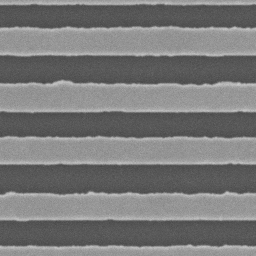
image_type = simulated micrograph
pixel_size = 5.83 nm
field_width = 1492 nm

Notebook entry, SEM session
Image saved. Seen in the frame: lines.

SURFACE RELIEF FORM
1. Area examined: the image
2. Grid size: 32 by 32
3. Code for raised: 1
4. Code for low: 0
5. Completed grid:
11111111111111111111111111111111
00000000000000000000000000000000
00000000000000000000000000000000
00110000100000111111111000100100
11111111111111111111111111111111
11111111111111111111111111111111
11111111111111111111111111111111
00000000000000000000000000000000
00000000000000000000000000000000
00000000000000000000000000000000
00111011110100000000000000011100
11111111111111111111111111111111
11111111111111111111111111111111
11111111111111111111111111111111
00000000000000000000000000000000
00000000000000000000000000000000
00000000000000000000000000000000
11111111111111111111111111111111
11111111111111111111111111111111
11111111111111111111111111111111
00000100000000000000000000000000
00000000000000000000000000000000
00000000000000000000000000000000
00000000000000000000000000000000
11111111111111111111111111111111
11111111111111111111111111111111
11111111111111111111111111111111
00110000000000000000000000010000
00000000000000000000000000000000
00000000000000000000000000000000
00000000000000000000000000000000
11111111111111111111111111111111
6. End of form